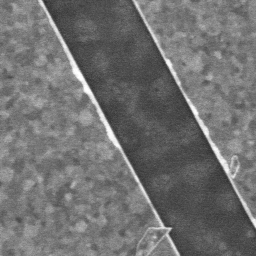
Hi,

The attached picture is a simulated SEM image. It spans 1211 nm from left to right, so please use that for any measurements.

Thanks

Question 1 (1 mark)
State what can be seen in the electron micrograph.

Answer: one or a few lines or trenches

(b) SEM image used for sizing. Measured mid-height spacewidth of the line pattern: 380 nanometers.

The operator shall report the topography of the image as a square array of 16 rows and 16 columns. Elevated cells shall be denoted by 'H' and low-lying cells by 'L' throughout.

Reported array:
HHHLLLLLLHHHHHHH
HHHLLLLLLHHHHHHH
HHHHLLLLLLHHHHHH
HHHHLLLLLLHHHHHH
HHHHHLLLLLLHHHHH
HHHHHHLLLLLHHHHH
HHHHHHLLLLLLHHHH
HHHHHHHLLLLLHHHH
HHHHHHHLLLLLLHHH
HHHHHHHHLLLLLHHH
HHHHHHHHLLLLLLHH
HHHHHHHHHLLLLLLH
HHHHHHHHHLLLLLLH
HHHHHHHHHHLLLLLL
HHHHHHHHHHLLLLLL
HHHHHHHHHHHLLLLL